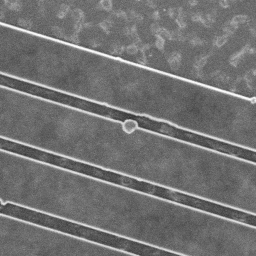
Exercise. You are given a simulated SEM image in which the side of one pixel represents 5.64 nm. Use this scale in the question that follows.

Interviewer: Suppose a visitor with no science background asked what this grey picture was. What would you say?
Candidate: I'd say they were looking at parallel lines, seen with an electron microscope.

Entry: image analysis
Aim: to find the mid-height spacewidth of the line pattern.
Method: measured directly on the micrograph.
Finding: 64.1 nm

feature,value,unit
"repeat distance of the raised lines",341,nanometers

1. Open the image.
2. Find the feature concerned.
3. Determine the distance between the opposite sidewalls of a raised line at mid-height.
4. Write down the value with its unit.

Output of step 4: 0.272 microns